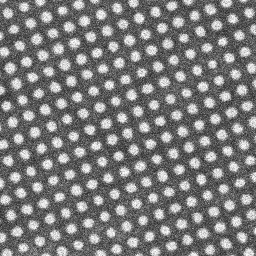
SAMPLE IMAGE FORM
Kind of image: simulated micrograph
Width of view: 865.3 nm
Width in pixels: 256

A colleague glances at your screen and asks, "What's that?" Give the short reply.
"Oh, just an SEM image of a regular array of raised bodies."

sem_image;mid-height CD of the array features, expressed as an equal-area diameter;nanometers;31.2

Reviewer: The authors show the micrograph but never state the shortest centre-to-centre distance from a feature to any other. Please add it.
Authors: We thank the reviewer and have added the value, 57 nm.